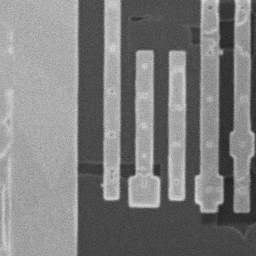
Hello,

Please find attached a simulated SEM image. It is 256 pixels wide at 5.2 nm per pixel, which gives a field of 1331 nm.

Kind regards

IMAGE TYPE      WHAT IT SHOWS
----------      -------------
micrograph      wiring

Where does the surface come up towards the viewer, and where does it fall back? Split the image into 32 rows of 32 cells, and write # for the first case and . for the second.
##########...##..........##...#.
##########...##..........##...#.
##########...##..........##..##.
##########...##..........##.....
##########...##.................
##########...##..........##.....
##########...##..##..##..##..##.
##########...##..##..##..##..##.
##########...##..##..##..##..##.
##########...##..##..##..##..##.
##########...##..##..##..##..##.
##########...##..##..##..##..##.
##########...##..##..##..##..##.
##########...##..##..##..##..##.
##########...##..##..##..##..##.
##########...##..##..##..##..##.
##########...##..##..##..##..##.
##########...##..##..##..##..###
##########...##..##..##..##..###
.#########...##..##..##..##..##.
.#########...##..##..##..##..##.
.#########...##......##..##..##.
.#########...##.####.##.####....
.#########...##.####.##.####....
.#########...##.####.##..###....
.#########......####.....##.....
.#########......................
.#########......................
.#########......................
.#########......................
.#########......................
.#########......................